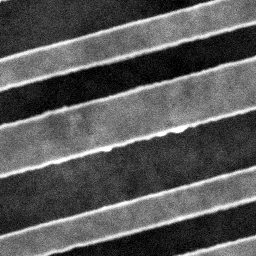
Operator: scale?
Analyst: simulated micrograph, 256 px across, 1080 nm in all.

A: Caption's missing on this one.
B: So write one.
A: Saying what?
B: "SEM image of lines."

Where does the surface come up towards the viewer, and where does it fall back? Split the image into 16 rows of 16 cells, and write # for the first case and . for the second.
............####
........########
....########....
.#######........
####.........###
.........#######
.....###########
..###########...
##########......
######..........
##..............
............####
........########
.....#######....
.#######........
####.........###